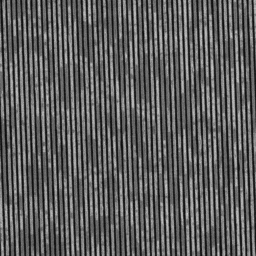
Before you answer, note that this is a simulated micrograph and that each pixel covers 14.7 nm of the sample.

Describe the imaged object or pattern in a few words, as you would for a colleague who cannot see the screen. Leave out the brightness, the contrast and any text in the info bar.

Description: parallel lines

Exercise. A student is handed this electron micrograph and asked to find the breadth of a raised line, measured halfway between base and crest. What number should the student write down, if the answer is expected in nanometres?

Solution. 38.5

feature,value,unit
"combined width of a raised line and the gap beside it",73.7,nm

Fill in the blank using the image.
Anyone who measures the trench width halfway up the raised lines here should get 38.5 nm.